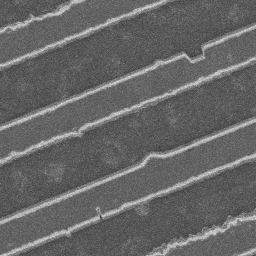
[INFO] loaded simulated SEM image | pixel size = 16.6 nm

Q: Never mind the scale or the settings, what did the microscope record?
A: one or a few lines or trenches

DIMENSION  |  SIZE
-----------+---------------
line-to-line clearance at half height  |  0.94 microns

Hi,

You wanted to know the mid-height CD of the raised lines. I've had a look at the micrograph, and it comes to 31.4 px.